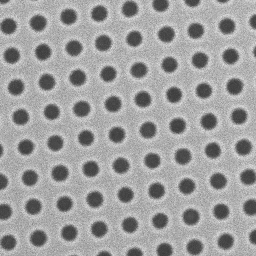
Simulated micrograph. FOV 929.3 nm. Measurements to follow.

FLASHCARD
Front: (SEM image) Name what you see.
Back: a regular array of holes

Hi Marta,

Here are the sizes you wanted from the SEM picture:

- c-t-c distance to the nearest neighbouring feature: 109 nm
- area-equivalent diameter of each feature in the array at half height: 56.9 nm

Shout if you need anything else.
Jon